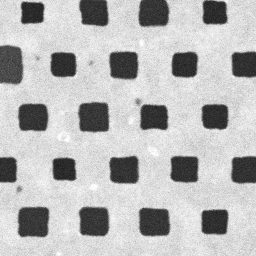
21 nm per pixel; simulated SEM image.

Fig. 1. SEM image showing a regular array of holes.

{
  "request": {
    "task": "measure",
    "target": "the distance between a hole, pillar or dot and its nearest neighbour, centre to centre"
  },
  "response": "1260 nanometers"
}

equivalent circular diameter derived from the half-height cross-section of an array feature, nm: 623